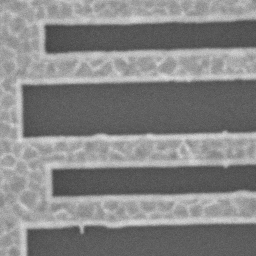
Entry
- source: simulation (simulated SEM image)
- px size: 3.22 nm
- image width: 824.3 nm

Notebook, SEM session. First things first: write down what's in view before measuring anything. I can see one or a few lines or trenches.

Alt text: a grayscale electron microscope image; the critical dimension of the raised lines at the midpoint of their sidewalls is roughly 84.1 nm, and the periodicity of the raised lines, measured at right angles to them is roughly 71.9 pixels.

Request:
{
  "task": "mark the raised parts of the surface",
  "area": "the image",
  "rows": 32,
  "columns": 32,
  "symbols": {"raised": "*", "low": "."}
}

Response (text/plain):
********************************
********************************
****************................
*****...........................
*****...........................
*****...........................
*****........................***
********************************
********************************
*******************************.
***.............................
**..............................
**..............................
**..............................
**..............................
**..............................
**..............................
***...****.*********************
********************************
********************************
*************...................
******..........................
******..........................
******..........................
******.......................***
********************************
********************************
***************************.****
***.............................
***.............................
***.............................
***.............................